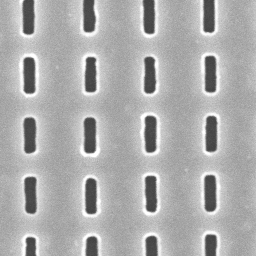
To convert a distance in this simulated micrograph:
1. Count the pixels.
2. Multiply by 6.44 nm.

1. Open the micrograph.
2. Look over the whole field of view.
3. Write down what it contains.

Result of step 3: a regular array of holes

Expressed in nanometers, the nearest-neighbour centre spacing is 383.